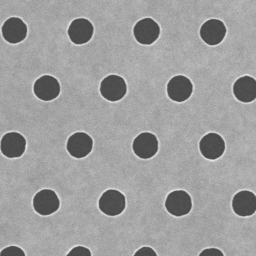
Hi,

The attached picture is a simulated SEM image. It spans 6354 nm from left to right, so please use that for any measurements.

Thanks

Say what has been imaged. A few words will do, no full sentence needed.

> a regular array of holes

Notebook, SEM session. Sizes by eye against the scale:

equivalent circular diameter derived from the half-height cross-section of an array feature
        0.662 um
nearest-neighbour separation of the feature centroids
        1.63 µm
